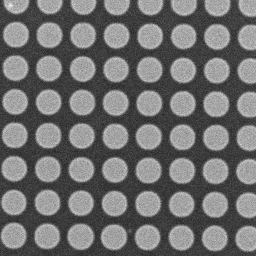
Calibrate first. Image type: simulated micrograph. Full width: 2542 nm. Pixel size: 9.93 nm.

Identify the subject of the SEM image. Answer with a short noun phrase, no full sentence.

an array of small figures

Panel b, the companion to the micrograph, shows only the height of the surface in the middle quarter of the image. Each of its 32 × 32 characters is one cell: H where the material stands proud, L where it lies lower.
LLHHHHHHLLHHHHHHLLLHHHHHLLLHHHHH
LLHHHHHHLLHHHHHHLLHHHHHHLLLHHHHH
LLHHHHHLLLHHHHHHLLLHHHHHLLLHHHHH
LLLHHHHLLLLHHHHLLLLHHHHHLLLHHHHH
LLLLLLLLLLLLLLLLLLLLLLLLLLLLLLLL
LLLLLLLLLLLLLLLLLLLLLLLLLLLLLLLL
LLLLLLLLLLLLLLLLLLLLLLLLLLLLLLLL
LLHHHHHLLLLHHHHLLLLHHHHLLLLLHHHL
LLHHHHHLLLHHHHHHLLLHHHHHLLLHHHHH
LLHHHHHLLLHHHHHHLLHHHHHHLLLHHHHH
LLHHHHHLLLHHHHHHLLHHHHHHLLLHHHHH
LLHHHHHLLLHHHHHLLLLHHHHHLLLHHHHH
LLLHHHLLLLLLHHLLLLLLHHHLLLLLHHHL
LLLLLLLLLLLLLLLLLLLLLLLLLLLLLLLL
LLLLLLLLLLLLLLLLLLLLLLLLLLLLLLLL
LLLHHHLLLLLHHHLLLLLLHHHLLLLLLHHL
LLHHHHHLLLHHHHHLLLLHHHHHLLLHHHHH
LLHHHHHLLLHHHHHHLLHHHHHHLLLHHHHH
LLHHHHHLLLHHHHHHLLHHHHHHLLLHHHHH
LLHHHHHLLLHHHHHHLLHHHHHHLLLHHHHH
LLLHHHLLLLLHHHHLLLLHHHHLLLLHHHHH
LLLLLLLLLLLLLLLLLLLLLLLLLLLLLLLL
LLLLLLLLLLLLLLLLLLLLLLLLLLLLLLLL
LLLLHLLLLLLLLLLLLLLLLLLLLLLLLLLL
LLHHHHHLLLHHHHHLLLLHHHHLLLLHHHHH
LHHHHHHLLLHHHHHHLLHHHHHHLLLHHHHH
LHHHHHHLLLHHHHHHLLHHHHHHLLLHHHHH
LLHHHHHLLLHHHHHHLLHHHHHHLLLHHHHH
LLHHHHHLLLHHHHHLLLLHHHHHLLLHHHHH
LLLLLLLLLLLLLLLLLLLLHHLLLLLLHHHL
LLLLLLLLLLLLLLLLLLLLLLLLLLLLLLLL
LLLLLLLLLLLLLLLLLLLLLLLLLLLLLLLL